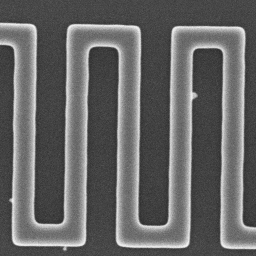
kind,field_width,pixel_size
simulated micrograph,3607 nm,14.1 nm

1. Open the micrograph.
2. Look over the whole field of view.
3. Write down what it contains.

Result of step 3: groups of lines, slits or small figures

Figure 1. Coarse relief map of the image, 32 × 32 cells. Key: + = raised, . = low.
................................
................................
................................
++++.....++++++++.....++++++++..
+++++...++++++++++....+++++++++.
+++++...++++++++++...++++++++++.
..++....+++....+++...+++....++..
..++....+++....+++...+++....++..
..++....+++....+++...+++....+++.
..++....+++....+++...+++....++..
..++....+++....+++...+++....++..
..++....+++....++....+++....++..
..++....+++....++....+++....++..
..++....+++....++....+++....++..
..++....+++....++....+++....++..
..++....+++....++....+++....++..
..++....+++....++....+++....++..
..++....+++....++....+++....++..
..++....+++....++....+++....++..
..++....+++....++....+++....++..
..++....+++....++....+++....++..
..++....+++....++....+++....++..
..++....+++....++....+++....++..
..++....+++....++....+++....++..
..++....+++....++....+++....++..
..++....+++....++....+++....++..
..++....+++....++....+++....++..
..++....+++....++....+++....++..
..+++++++++....+++++++++....++++
..+++++++++....+++++++++....++++
..++++++++.....++++++++.....++++
................................